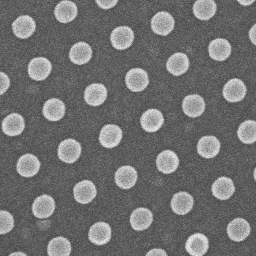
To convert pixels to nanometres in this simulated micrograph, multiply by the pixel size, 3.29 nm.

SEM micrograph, a regular array of raised bodies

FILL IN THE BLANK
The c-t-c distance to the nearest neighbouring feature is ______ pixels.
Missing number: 43.6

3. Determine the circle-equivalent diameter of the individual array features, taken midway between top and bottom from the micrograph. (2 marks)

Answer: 73.2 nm